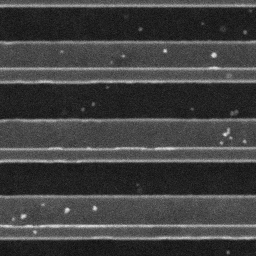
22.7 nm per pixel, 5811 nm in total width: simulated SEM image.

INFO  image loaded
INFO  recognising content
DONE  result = lines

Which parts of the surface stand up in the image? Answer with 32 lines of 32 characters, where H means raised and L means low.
HHHHHHHHHHHHHHHHHHHHHHHHHHHHHHHH
LLLLLLLLLLLLLLLLLLLLLLLLLLLLLLLL
LLLLLLLLLLLLLLLLLLLLLLLLLLLLLLLL
LLLLLLLLLLLLLLLLLLLLLLLLLLLLLLLL
LLLLLLLLLLLLLLLLLLLLLLLLLLLLLLLL
HHHHHHHHHHHHHHHHHHHHHHHHHHHHHHHH
HHHHHHHHHHHHHHHHHHHHHHHHHHHHHHHH
HHHHHHHHHHHHHHHHHHHHHHHHHHHHHHHH
HHHHHHHHHHHHHHHHHHHHHHHHHHHHHHHH
HHHHHHHHHHHHHHHHHHHHHHHHHHHHHHHH
LLLLLLLLLLLLLLLLLLLLLLLLLLLLLLLL
LLLLLLLLLLLLLLLLLLLLLLLLLLLLLLLL
LLLLLLLLLLLLLLLLLLLLLLLLLLLLLLLL
LLLLLLLLLLLLLLLLLLLLLLLLLLLLLLLL
LLLLLLLLLLLLLLLLLLLLLLLLLLLLLLLL
HHHHHHHHHHHHHHHHHHHHHHHHHHHHHHHH
HHHHHHHHHHHHHHHHHHHHHHHHHHHHHHHH
HHHHHHHHHHHHHHHHHHHHHHHHHHHHHHHH
HHHHHHHHHHHHHHHHHHHHHHHHHHHHHHHH
HHHHHHHHHHHHHHHHHHHHHHHHHHHHHHHH
LLLLLLLLLLLLLLLLLLLLLLLLLLLLLLLL
LLLLLLLLLLLLLLLLLLLLLLLLLLLLLLLL
LLLLLLLLLLLLLLLLLLLLLLLLLLLLLLLL
LLLLLLLLLLLLLLLLLLLLLLLLLLLLLLLL
LLLLLLLLLLLLLLLLLLLLLLLLLLLLLLLL
HHHHHHHHHHHHHHHHHHHHHHHHHHHHHHHH
HHHHHHHHHHHHHHHHHHHHHHHHHHHHHHHH
HHHHHHHHHHHHHHHHHHHHHHHHHHHHHHHH
HHHHHHHHHHHHHHHHHHHHHHHHHHHHHHHH
HHHHHHHHHHHHHHHHHHHHHHHHHHHHHHHH
LLLLLLLLLLLLLLLLLLLLLLLLLLLLLLLL
LLLLLLLLLLLLLLLLLLLLLLLLLLLLLLLL